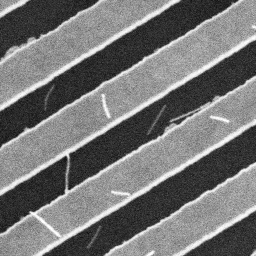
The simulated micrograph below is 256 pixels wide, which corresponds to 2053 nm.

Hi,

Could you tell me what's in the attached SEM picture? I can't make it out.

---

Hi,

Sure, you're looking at lines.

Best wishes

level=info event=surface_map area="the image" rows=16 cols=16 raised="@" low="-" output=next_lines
@-----@@@@----@@
----@@@@@----@@@
--@@@@@----@@@@@
-@@@@@---@@@@@--
@@@@----@@@@@---
@@----@@@@@----@
@---@@@@@----@@@
---@@@@@----@@@@
-@@@@@----@@@@@-
@@@@----@@@@@---
@@@----@@@@@---@
@----@@@@@----@@
---@@@@@----@@@@
--@@@@@----@@@@-
@@@@@----@@@@@--
@@@----@@@@@----